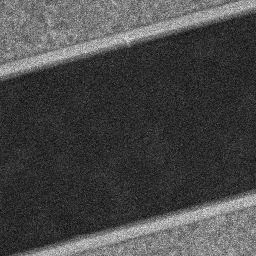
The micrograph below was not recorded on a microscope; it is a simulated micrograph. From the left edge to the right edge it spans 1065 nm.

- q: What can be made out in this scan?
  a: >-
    one or a few lines or trenches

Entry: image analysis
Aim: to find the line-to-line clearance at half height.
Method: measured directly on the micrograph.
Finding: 189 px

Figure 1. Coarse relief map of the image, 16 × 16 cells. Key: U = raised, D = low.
UUUUUUUUUUUUUUUD
UUUUUUUUUUUDDDDD
UUUUUUUDDDDDDDDD
UUUUDDDDDDDDDDDD
DDDDDDDDDDDDDDDD
DDDDDDDDDDDDDDDD
DDDDDDDDDDDDDDDD
DDDDDDDDDDDDDDDD
DDDDDDDDDDDDDDDD
DDDDDDDDDDDDDDDD
DDDDDDDDDDDDDDDD
DDDDDDDDDDDDDDDD
DDDDDDDDDDDDDDDD
DDDDDDDDDDDDUUUU
DDDDDDDDUUUUUUUU
DDDDUUUUUUUUUUUU